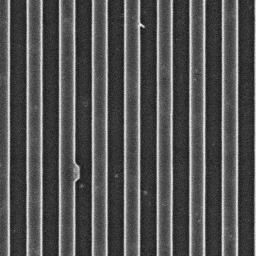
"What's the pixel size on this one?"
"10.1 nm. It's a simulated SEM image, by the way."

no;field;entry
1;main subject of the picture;parallel lines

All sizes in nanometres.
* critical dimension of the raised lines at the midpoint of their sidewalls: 149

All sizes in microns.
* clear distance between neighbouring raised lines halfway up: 0.178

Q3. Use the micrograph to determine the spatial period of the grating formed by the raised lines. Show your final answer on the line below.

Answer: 327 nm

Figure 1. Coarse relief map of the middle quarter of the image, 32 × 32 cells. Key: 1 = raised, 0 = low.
11100001111000011110000011100000
11100001111000011110000011100000
11100001111000011110000011100000
11100001111000011110000011100000
11100001111000011110000011100000
11100001111000011110000011100000
11100001111000011110000011100000
11100001111000011110000011100000
11100001111000011110000011100000
11100001111000011110000011100000
11100001111000011110000011100000
11100001111000011110000011100000
11100001111000011110000011100000
11100001111000011110000011100000
11100001111000011110000011100000
11100001111000011110000011100000
11100001111000011110000011100000
11100001111000011110000011100000
11100001111000011110000011100000
11100001111000011110000011100000
11100001111000011110000011100000
11100001110000011110000011100000
11100001110000011110000011100000
11100001110000011110000011100000
11100001110000011110000011100000
11110001110000011110000011100000
11110001110000011110000111100000
11110001110000011110000111100000
11110001110000011110000111100000
11100001110000011110000111100000
11100001110000011110000111100000
11100001110000011110000111100000